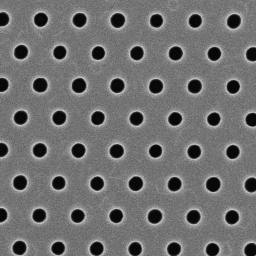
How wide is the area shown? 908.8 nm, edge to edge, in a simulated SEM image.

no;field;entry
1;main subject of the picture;a regular array of holes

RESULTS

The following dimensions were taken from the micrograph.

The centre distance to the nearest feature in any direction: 134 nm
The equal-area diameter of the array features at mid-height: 45.6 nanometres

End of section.